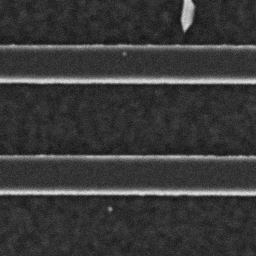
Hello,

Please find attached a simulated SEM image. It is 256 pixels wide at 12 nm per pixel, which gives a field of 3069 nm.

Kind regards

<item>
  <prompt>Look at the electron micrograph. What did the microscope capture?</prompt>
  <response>lines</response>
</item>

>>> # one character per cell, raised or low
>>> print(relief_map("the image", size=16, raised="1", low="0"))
0000000000000000
0000000000000000
0000000000000000
1111111111111111
1111111111111111
0000000000000000
0000000000000000
0000000000000000
0000000000000000
0000000000000000
1111111111111111
1111111111111111
0000000000000000
0000000000000000
0000000000000000
0000000000000000